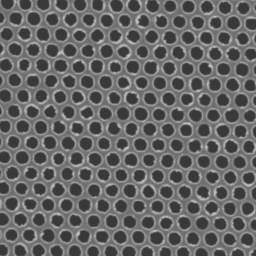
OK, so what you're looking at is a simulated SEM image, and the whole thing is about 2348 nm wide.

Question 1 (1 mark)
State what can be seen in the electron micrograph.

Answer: a regular array of holes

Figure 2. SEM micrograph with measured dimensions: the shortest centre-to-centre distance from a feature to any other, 0.161 µm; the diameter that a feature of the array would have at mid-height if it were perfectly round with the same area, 110 nm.